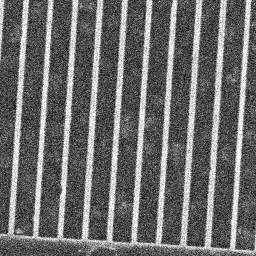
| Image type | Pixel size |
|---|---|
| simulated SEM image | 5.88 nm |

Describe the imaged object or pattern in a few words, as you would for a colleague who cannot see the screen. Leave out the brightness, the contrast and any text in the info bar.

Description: parallel lines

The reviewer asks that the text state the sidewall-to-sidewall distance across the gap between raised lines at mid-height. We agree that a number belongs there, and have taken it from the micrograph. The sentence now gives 118 nm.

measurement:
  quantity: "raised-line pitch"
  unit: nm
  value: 145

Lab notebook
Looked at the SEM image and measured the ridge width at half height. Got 0.0308 um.